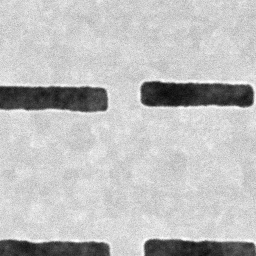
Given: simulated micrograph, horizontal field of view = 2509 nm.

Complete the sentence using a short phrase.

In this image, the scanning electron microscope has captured holes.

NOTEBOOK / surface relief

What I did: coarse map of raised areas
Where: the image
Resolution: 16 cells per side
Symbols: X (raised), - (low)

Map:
XXXXXXXXXXXXXXXX
XXXXXXXXXXXXXXXX
XXXXXXXXXXXXXXXX
XXXXXXXXXXXXXXXX
XXXXXXXXXXXXXXXX
------XXX-------
-------XX-------
XXXXXXXXXXXXXXXX
XXXXXXXXXXXXXXXX
XXXXXXXXXXXXXXXX
XXXXXXXXXXXXXXXX
XXXXXXXXXXXXXXXX
XXXXXXXXXXXXXXXX
XXXXXXXXXXXXXXXX
XXXXXXXXXXXXXXXX
-------XX-------